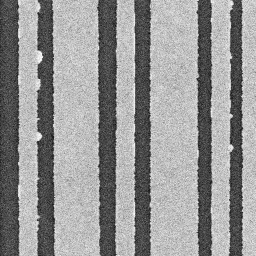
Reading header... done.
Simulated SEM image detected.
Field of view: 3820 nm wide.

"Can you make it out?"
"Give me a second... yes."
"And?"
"lines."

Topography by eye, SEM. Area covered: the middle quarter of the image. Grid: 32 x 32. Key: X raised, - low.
XXXXXXXX------XXX-----XXXXXXXXXX
XXXXXXXX-----XXXX-----XXXXXXXXXX
XXXXXXXX-----XXXX-----XXXXXXXXXX
XXXXXXXX-----XXXX-----XXXXXXXXXX
XXXXXXXX-----XXXX-----XXXXXXXXXX
XXXXXXXX-----XXXX-----XXXXXXXXXX
XXXXXXXX-----XXXX-----XXXXXXXXXX
XXXXXXXXX----XXXX-----XXXXXXXXXX
XXXXXXXX-----XXXX-----XXXXXXXXXX
XXXXXXXXX----XXXX-----XXXXXXXXXX
XXXXXXXX-----XXXX-----XXXXXXXXXX
XXXXXXXXX----XXXX-----XXXXXXXXXX
XXXXXXXXX----XXXX-----XXXXXXXXXX
XXXXXXXXX----XXXXX----XXXXXXXXXX
XXXXXXXXX----XXXX-----XXXXXXXXXX
XXXXXXXX-----XXXX-----XXXXXXXXXX
XXXXXXXXX----XXXX-----XXXXXXXXXX
XXXXXXXX-----XXXX-----XXXXXXXXXX
XXXXXXXX-----XXXXX----XXXXXXXXXX
XXXXXXXXX----XXXX-----XXXXXXXXXX
XXXXXXXXX----XXXX-----XXXXXXXXXX
XXXXXXXX-----XXXX-----XXXXXXXXXX
XXXXXXXX-----XXXX-----XXXXXXXXXX
XXXXXXXXX----XXXX-----XXXXXXXXXX
XXXXXXXXX----XXXX-----XXXXXXXXXX
XXXXXXXX-----XXXX-----XXXXXXXXXX
XXXXXXXXX----XXXXX----XXXXXXXXXX
XXXXXXXXX----XXXX-----XXXXXXXXXX
XXXXXXXXX----XXXX-----XXXXXXXXXX
XXXXXXXXX----XXXXX----XXXXXXXXXX
XXXXXXXXX----XXXXX----XXXXXXXXXX
XXXXXXXXX----XXXXX----XXXXXXXXXX